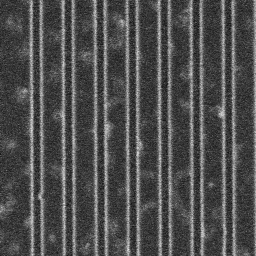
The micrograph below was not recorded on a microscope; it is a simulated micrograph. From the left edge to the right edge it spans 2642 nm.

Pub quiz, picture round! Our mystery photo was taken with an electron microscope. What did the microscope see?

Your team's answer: parallel lines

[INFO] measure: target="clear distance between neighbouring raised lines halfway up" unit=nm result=89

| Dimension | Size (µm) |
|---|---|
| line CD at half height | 0.241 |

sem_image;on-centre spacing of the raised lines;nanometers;330